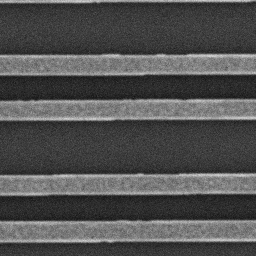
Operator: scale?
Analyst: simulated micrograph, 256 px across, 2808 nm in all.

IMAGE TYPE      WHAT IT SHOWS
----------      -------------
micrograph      lines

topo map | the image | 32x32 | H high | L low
LLLLLLLLLLLLLLLLLLLLLLLLLLLLLLLL
LLLLLLLLLLLLLLLLLLLLLLLLLLLLLLLL
LLLLLLLLLLLLLLLLLLLLLLLLLLLLLLLL
LLLLLLLLLLLLLLLLLLLLLLLLLLLLLLLL
LLLLLLLLLLLLLLLLLLLLLLLLLLLLLLLL
LLLLLLLLLLLLLLLLLLLLLLLLLLLLLLLL
LLLLLLLLLLLLLLLLLLLLLLLLLLLLLLLL
HHHHHHHHHHHHHHHHHHHHHHHHHHHHHHHH
HHHHHHHHHHHHHHHHHHHHHHHHHHHHHHHH
LLLLLLLLLLLLLLLLLLLLLLLLLLLLLLLL
LLLLLLLLLLLLLLLLLLLLLLLLLLLLLLLL
LLLLLLLLLLLLLLLLLLLLLLLLLLLLLLLL
LLLLLLLLLLLLLLLLLHHHHLLHHHHHHHHH
HHHHHHHHHHHHHHHHHHHHHHHHHHHHHHHH
HHHHHHHHHHHHHHHHHHHHHHHHHHHHHHHH
LLLLLLLLLLLLLLLLLLLLLLLLLLLLLLLL
LLLLLLLLLLLLLLLLLLLLLLLLLLLLLLLL
LLLLLLLLLLLLLLLLLLLLLLLLLLLLLLLL
LLLLLLLLLLLLLLLLLLLLLLLLLLLLLLLL
LLLLLLLLLLLLLLLLLLLLLLLLLLLLLLLL
LLLLLLLLLLLLLLLLLLLLLLLLLLLLLLLL
LLLLLLLLLLLLLLLLLLLLLLLLLLLLLLLL
HHHHHHHHHHHHHHHHHHHHHHHHHHHHHHHH
HHHHHHHHHHHHHHHHHHHHHHHHHHHHHHHH
LLLLLLLLLLLLLLLLLLLLLLLLLLLLLLLL
LLLLLLLLLLLLLLLLLLLLLLLLLLLLLLLL
LLLLLLLLLLLLLLLLLLLLLLLLLLLLLLLL
LLLLLLLLLLLLLLLLLLLLLLLLLLLLLLLL
HHHHHHHHHHHHHHHHHHHHHHHHHHHHHHHH
HHHHHHHHHHHHHHHHHHHHHHHHHHHHHHHH
LLLLLLLLLLLLLLLLLLLLLLLLLLLLLLLL
LLLLLLLLLLLLLLLLLLLLLLLLLLLLLLLL